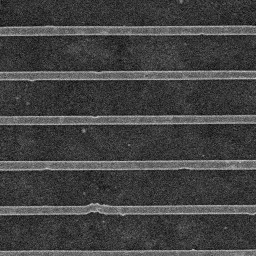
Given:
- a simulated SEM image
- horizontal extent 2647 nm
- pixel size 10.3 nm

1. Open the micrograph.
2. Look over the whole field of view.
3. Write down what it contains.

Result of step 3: parallel lines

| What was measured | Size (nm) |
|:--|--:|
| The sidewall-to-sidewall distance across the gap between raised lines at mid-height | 372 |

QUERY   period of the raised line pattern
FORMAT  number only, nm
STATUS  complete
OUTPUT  463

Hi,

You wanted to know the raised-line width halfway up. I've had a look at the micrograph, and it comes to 87.9 nm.